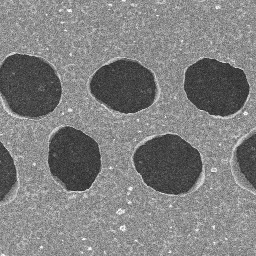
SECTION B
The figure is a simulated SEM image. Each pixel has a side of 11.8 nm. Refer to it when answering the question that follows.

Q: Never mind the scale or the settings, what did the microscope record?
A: holes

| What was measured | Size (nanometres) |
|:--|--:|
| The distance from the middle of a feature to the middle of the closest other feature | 1050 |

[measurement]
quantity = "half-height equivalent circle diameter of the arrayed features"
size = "708 nanometres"